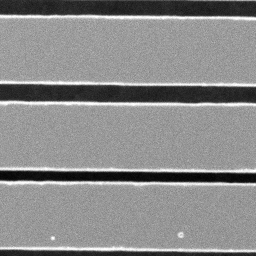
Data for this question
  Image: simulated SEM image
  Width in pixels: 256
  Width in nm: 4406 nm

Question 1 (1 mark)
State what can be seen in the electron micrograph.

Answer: lines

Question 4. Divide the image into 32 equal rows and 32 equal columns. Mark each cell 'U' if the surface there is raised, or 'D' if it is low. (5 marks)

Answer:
DDDDDDDDDDDDDDDDDDDDDDDDDDDDDDDD
DDDDDDDDDDDDDDDDDDDDDDDDDDDDDDDD
UUUUUUUUUUUUUUUUUUUUUUUUUUUUUUUU
UUUUUUUUUUUUUUUUUUUUUUUUUUUUUUUU
UUUUUUUUUUUUUUUUUUUUUUUUUUUUUUUU
UUUUUUUUUUUUUUUUUUUUUUUUUUUUUUUU
UUUUUUUUUUUUUUUUUUUUUUUUUUUUUUUU
UUUUUUUUUUUUUUUUUUUUUUUUUUUUUUUU
UUUUUUUUUUUUUUUUUUUUUUUUUUUUUUUU
UUUUUUUUUUUUUUUUUUUUUUUUUUUUUUUU
DDDDDUUUUUUUUUUUUUUUUUUUUUUUUUUU
DDDDDDDDDDDDDDDDDDDDDDDDDDDDDDDD
DDDDDDDDDDDDDDDDDDDDDDDDDDDDDDDD
UUUUUUUUUUUUUUUUUUUUUUUUUUUUUUUU
UUUUUUUUUUUUUUUUUUUUUUUUUUUUUUUU
UUUUUUUUUUUUUUUUUUUUUUUUUUUUUUUU
UUUUUUUUUUUUUUUUUUUUUUUUUUUUUUUU
UUUUUUUUUUUUUUUUUUUUUUUUUUUUUUUU
UUUUUUUUUUUUUUUUUUUUUUUUUUUUUUUU
UUUUUUUUUUUUUUUUUUUUUUUUUUUUUUUU
UUUUUUUUUUUUUUUUUUUUUUUUUUUUUUUU
DDDDDDDDDDDDDDDDDDDDDDDDDDDDDUUU
DDDDDDDDDDDDDDDDDDDDDDDDDDDDDDDD
UUUUUUUUUUUUUUUUUUUUUUUUUUUUUUUU
UUUUUUUUUUUUUUUUUUUUUUUUUUUUUUUU
UUUUUUUUUUUUUUUUUUUUUUUUUUUUUUUU
UUUUUUUUUUUUUUUUUUUUUUUUUUUUUUUU
UUUUUUUUUUUUUUUUUUUUUUUUUUUUUUUU
UUUUUUUUUUUUUUUUUUUUUUUUUUUUUUUU
UUUUUUUUUUUUUUUUUUUUUUUUUUUUUUUU
UUUUUUUUUUUUUUUUUUUUUUUUUUUUUUUU
DDDDDDDDDDDDDDDDDDDDDDDDDDDDDDDD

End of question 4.